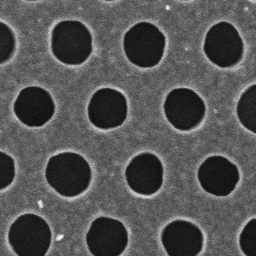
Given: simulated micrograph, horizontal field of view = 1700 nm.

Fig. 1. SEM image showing a regular array of holes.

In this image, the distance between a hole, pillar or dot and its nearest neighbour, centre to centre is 0.488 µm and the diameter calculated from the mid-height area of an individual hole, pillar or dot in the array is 41.7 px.